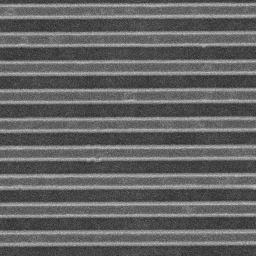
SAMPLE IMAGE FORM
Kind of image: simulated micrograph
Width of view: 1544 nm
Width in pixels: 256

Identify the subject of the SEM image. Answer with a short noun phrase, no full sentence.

parallel lines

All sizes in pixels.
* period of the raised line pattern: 28.4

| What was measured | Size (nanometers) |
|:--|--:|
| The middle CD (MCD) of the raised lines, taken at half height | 80.6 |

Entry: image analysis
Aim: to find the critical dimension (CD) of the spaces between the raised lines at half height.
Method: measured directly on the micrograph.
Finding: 0.0927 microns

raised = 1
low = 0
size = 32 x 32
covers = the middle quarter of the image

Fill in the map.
11111111111111111111111111111111
11111111111111111111111111111111
00000000000000000000000000000000
00000000000000000000000000000000
00000000000000000000000000000000
00000000000000000000000000000000
00000000000111111111111111111111
11111111111111111111111111111111
11111111111111111111111111111111
11111111111111111111111111111110
00000000000000000000000000000000
00000000000000000000000000000000
00000000000000000000000000000000
00000000000000000000000000000000
11111111111111111111111111111111
11111111111111111111111111111111
11111111111111111111111000000010
00000000000000000000000000000000
00000000000000000000000000000000
00000000000000000000000000000000
00000000000000000000000000000000
11111111111111111111111111111111
11111111111111111111111111111111
11111111111111111111111111111111
00000000000000000000000000000000
00000000000000000000000000000000
00000000000000000000000000000000
00000000000000000000000000000000
11111111111111111111111111111111
11111111111111111111111111111111
11111111111111111111111111111111
00000000000000000000000000000000